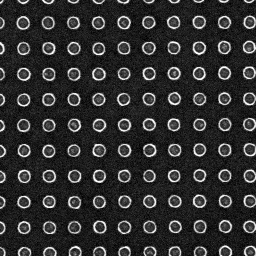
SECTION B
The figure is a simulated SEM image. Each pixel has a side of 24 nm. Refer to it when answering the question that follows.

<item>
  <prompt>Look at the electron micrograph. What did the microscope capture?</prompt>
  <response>a regular array of raised bodies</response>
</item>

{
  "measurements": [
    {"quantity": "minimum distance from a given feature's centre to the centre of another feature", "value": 598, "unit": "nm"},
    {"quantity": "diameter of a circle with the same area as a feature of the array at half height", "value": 285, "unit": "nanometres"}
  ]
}